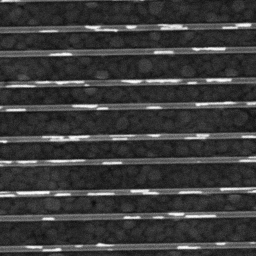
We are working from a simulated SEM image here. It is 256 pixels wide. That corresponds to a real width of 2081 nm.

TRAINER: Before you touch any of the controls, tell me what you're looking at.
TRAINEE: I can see parallel lines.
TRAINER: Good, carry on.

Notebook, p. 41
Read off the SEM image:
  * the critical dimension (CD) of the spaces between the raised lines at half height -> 170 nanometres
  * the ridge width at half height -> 0.0427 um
